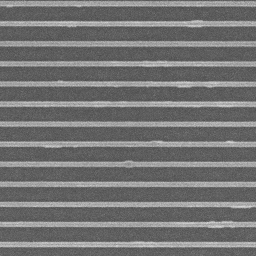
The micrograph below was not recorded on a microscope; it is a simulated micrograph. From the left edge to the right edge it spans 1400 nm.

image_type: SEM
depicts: parallel lines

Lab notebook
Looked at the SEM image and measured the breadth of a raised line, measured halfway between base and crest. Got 4.88 px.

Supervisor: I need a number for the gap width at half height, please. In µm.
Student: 0.0861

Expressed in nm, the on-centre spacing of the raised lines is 110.